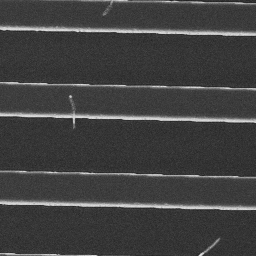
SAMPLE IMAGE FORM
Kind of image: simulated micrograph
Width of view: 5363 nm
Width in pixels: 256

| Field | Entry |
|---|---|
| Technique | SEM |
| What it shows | lines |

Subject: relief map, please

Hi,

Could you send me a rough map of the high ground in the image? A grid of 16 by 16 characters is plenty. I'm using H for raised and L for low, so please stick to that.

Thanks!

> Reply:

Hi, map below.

HHHHHHHHHHHHHHHH
HHHHHHHHHHHHHHHH
LLLLLLLLLLLLLLLL
LLLLLLLLLLLLLLLL
LLLLLLLLLLLLLLLL
HHHHHHHHHHHHHLLL
HHHHHHHHHHHHHHHH
LLLLLLLLLLHHHHHH
LLLLLLLLLLLLLLLL
LLLLLLLLLLLLLLLL
LLLLLLLLLLLLLLLL
HHHHHHHHHHHHHHHH
HHHHHHHHHHHHHHHH
LLLLLLLLLLLLLLLL
LLLLLLLLLLLLLLLL
LLLLLLLLLLLLLLLL